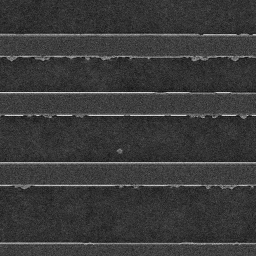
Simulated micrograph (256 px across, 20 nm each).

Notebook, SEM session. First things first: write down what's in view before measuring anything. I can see lines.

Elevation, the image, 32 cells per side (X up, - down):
--------------------------------
--------------------------------
--------------------------------
--------------------------------
XXXXXXXXXXXXXXXXXXXXXXXXXXXXXXXX
XXXXXXXXXXXXXXXXXXXXXXXXXXXXXXXX
XXXXXXXXXXXXXXXXXXXXXXXXXXXXXXXX
--------------------------------
--------------------------------
--------------------------------
--------------------------------
--------------------------------
XXXXXXXXXXXXXXXXXXXXXXXXXXXXXXXX
XXXXXXXXXXXXXXXXXXXXXXXXXXXXXXXX
--------------------------X---X-
--------------------------------
--------------------------------
--------------------------------
--------------------------------
--------------------------------
XXXXXXXXXXXXXXXXXXXXXXXXXXXXXXXX
XXXXXXXXXXXXXXXXXXXXXXXXXXXXXXXX
XXXXXXXXXXXXXXXXXXXXXXXXXXXXXXXX
--------------------------------
--------------------------------
--------------------------------
--------------------------------
--------------------------------
--------------------------------
--------------------------------
XXXXXXXXXXXXXXXXXXXXXXXXXXXXXXXX
XXXXXXXXXXXXXXXXXXXXXXXXXXXXXXXX